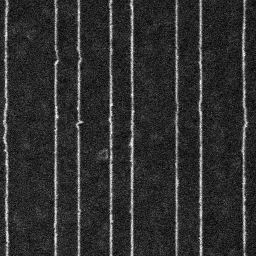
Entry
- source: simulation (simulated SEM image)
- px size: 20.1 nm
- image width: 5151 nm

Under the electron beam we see one or a few lines or trenches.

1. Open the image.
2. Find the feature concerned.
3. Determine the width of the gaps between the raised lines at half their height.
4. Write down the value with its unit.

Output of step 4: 873 nanometres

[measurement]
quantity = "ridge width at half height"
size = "476 nm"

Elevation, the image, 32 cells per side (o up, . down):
o......ooo....ooo.....ooo......o
o......ooo....ooo.....ooo......o
o......ooo....ooo.....ooo.....oo
o......ooo....ooo.....ooo.....oo
o......ooo....ooo.....ooo.....oo
o......ooo....ooo.....ooo.....oo
o......ooo....ooo.....ooo.....oo
o......ooo....ooo.....ooo.....oo
o......ooo....ooo.....ooo.....oo
o......ooo....ooo.....ooo.....oo
o......ooo....ooo.....ooo.....oo
o......ooo....ooo.....ooo.....oo
o......ooo....ooo.....ooo.....oo
o......ooo....ooo.....ooo.....oo
o......ooo....ooo.....ooo......o
o......ooo....ooo.....ooo......o
o......ooo....ooo.....ooo.....oo
o......ooo....ooo.....ooo.....oo
o......ooo....ooo.....ooo.....oo
o......ooo....ooo.....ooo.....oo
o......ooo....ooo.....ooo.....oo
o......ooo....ooo.....ooo.....oo
o......ooo....ooo.....ooo.....oo
o......ooo....oo......ooo.....oo
o......ooo....ooo.....ooo.....oo
o......ooo....ooo.....ooo.....oo
o......ooo....oo......ooo.....oo
o......ooo....ooo.....ooo.....oo
o......ooo....ooo.....ooo.....oo
o......ooo....ooo.....ooo.....oo
o......ooo....ooo.....ooo.....oo
o......ooo....ooo.....ooo......o